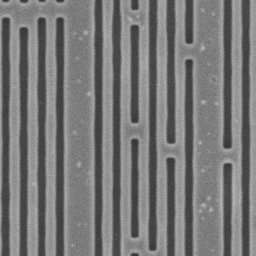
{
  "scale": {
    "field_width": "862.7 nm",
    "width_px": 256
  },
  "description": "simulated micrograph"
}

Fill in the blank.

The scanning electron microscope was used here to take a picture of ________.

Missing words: groups of lines, slits or small figures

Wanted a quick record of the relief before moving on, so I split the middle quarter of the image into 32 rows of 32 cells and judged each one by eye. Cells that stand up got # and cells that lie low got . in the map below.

#######...##..##...##..##...##..
#######...##..##...##..##...##..
#######...##..##...##..##...##..
#######...##..##...##..##...##..
#######...##..##...##..##...##..
#######...##..###..##..##...##..
#######...##..###..##..##...##..
########..##..###..##..##...##..
########..##..##...##..##...##..
########..##..##...##..##...##..
########..##..##...##..###..##..
########..##..##...##..###..##..
#######...##..##...##..###..##..
#######...##..###..##..###..##..
#######...##..###..##..###..##..
#######...##..#######..##...##..
#######...##..#######..##...##..
#######...##..#######..##...##..
#######...##..###.###..##...##..
#######...##..###..##..###..##..
#######...##..###..##..#######..
########..##..###..##..#######..
########..##..###..##..#######..
#######...##..###..##..###.###..
#######...##..###..##..##...##..
#######...##..###..##..##...##..
#######...##..###..##..###..##..
#######...##..###..##..###..##..
#######...##..###..##..###..##..
#######...##..###..##..###..##..
#######...##..###..##..###..##..
#######...##..###..##..###..##..